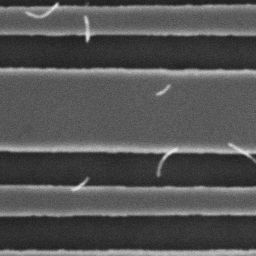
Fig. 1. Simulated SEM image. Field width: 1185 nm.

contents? lines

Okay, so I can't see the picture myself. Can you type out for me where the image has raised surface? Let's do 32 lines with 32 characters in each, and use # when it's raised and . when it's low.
................................
################################
################################
################################
..........#.....................
................................
................................
................................
................................
################################
################################
################################
################################
################################
################################
################################
################################
################################
################################
................................
................................
................................
................................
################################
################################
################################
################################
................................
................................
................................
................................
##.######.#..#####.........#####